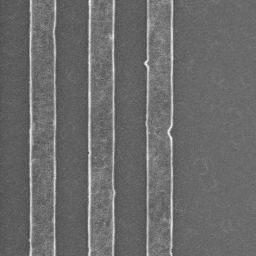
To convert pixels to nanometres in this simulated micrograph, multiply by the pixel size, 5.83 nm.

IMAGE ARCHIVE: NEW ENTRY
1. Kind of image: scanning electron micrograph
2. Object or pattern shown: parallel lines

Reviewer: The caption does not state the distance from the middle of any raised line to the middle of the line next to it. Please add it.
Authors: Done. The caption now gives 339 nm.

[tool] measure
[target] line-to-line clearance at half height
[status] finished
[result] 197 nanometers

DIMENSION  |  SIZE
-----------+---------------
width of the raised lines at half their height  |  146 nm